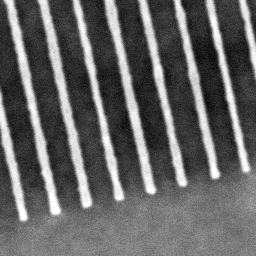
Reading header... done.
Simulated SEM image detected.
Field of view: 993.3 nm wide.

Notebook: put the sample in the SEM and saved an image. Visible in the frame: parallel lines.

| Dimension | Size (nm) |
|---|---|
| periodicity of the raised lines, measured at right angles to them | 126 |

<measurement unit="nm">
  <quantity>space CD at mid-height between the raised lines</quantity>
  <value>101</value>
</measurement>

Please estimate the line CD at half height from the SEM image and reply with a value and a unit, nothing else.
23.7 nm